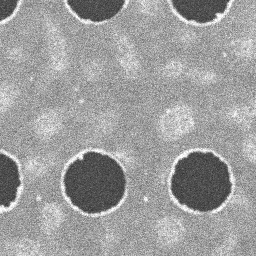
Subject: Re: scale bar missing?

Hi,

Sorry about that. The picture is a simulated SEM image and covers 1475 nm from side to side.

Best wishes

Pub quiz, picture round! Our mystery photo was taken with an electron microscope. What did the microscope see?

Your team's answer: holes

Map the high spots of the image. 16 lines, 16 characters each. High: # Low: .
.###....###...##
################
################
################
################
################
################
################
################
############.###
.###....###...##
.###....###...##
.###....###...##
################
################
################